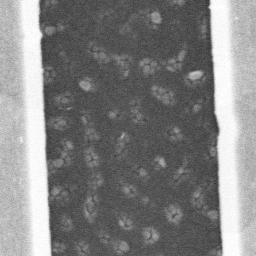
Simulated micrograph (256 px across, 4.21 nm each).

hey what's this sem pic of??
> one or a few lines or trenches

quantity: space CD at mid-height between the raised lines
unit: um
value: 0.808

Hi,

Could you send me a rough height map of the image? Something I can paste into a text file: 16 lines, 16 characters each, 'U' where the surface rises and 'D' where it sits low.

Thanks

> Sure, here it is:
UUDDDDDDDDDDDDUU
UUDDDDDDDDDDDDUU
UUDDDDDDDDDDDDUU
UUDDDDDDDDDDDDUU
UUDDDDDDDDDDDDUU
UUDDDDDDDDDDDDUU
UUDDDDDDDDDDDDUU
UUDDDDDDDDDDDDUU
UUDDDDDDDDDDDDUU
UUDDDDDDDDDDDDUU
UUDDDDDDDDDDDDUU
UUDDDDDDDDDDDDUU
UUDDDDDDDDDDDDUU
UUDDDDDDDDDDDDUU
UUDDDDDDDDDDDDUU
UUUDDDDDDDDDDDDU